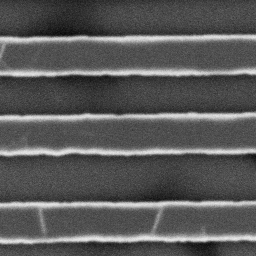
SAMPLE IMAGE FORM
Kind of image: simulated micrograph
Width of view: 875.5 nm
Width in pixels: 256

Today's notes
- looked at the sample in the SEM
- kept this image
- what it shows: lines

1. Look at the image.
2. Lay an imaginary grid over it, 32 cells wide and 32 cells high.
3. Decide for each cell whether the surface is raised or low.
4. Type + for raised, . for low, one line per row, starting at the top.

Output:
................................
................................
................................
................................
...........................+.+++
++++++++++++++++++++++++++++++++
++++++++++++++++++++++++++++++++
++++++++++++++++++++++++++++++++
++++++++++++++++++++++++++++++++
................................
................................
................................
................................
................................
..........++.+++++++++++++++++++
++++++++++++++++++++++++++++++++
++++++++++++++++++++++++++++++++
++++++++++++++++++++++++++++++++
++++++++++++++++++++++++++++++++
................................
................................
................................
................................
................................
................................
.++.+.+..+++++....++++++++++++++
++++++++++++++++++++++++++++++++
++++++++++++++++++++++++++++++++
++++++++++++++++++++++++++++++++
++++++++++++++++++++++++++++++++
................................
................................